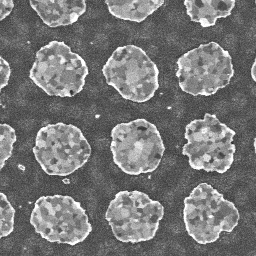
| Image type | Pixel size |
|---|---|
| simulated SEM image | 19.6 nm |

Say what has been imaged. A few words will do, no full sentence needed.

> a regular array of raised bodies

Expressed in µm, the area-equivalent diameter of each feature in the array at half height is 1.04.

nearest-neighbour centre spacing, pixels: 70.9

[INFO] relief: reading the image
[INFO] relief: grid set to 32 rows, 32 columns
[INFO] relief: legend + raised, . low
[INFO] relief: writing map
++..+++++++..+++++++...++++++...
+....+++++....+++++.....+++++...
.....++++.......++......+++.....
................................
................................
......++..................+.....
.....++++.....++++......++++....
....++++++....+++++...+++++++...
+...+++++++..+++++++..+++++++...
+...+++++++..+++++++..+++++++...
+....+++++....++++++..++++++....
......++++.....++++....++++.....
................++..............
................................
..........................+.....
.......+.......++++.....++++....
++...+++++....++++++...++++++...
++...++++++...++++++...++++++...
+...+++++++...++++++...++++++...
+...+++++++...++++++...++++++...
.....+++++.....+++++....+++++...
......+++.......++..............
................................
........................+++.....
+..............+++......++++....
+...++++++....++++++...++++++...
++..+++++++..+++++++...+++++++..
++..+++++++..+++++++...+++++++..
++..+++++++...++++++...++++++...
.....++++++...+++++.....+++.....
................................
................................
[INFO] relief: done